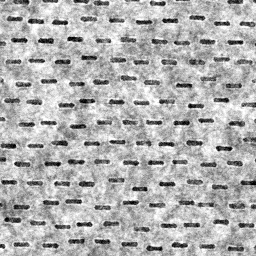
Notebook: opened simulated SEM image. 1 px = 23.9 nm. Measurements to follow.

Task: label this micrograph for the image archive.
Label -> a regular array of holes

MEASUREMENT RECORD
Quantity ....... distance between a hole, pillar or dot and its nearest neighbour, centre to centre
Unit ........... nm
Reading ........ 526